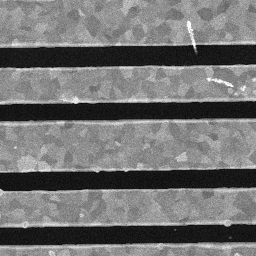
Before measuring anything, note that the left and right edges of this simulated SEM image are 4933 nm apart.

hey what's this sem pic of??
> lines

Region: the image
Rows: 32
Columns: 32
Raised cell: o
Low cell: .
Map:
oooooooooooooooooooooooooooooooo
oooooooooooooooooooooooooooooooo
oooooooooooooooooooooooooooooooo
oooooooooooooooooooooooooooooooo
oooooooooooooooooooooooooooooooo
oooooooooooooooooooooooooooooo..
................................
................................
oo..oooooooooooooooooooooooooooo
oooooooooooooooooooooooooooooooo
oooooooooooooooooooooooooooooooo
oooooooooooooooooooooooooooooooo
oooooooooooooooooooooooooooooooo
................................
................................
oooooooooooooooooooooooooooooooo
oooooooooooooooooooooooooooooooo
oooooooooooooooooooooooooooooooo
oooooooooooooooooooooooooooooooo
oooooooooooooooooooooooooooooooo
oooooooooooooooooooooooooooooooo
oooo............................
................................
................................
oooooooooooooooooooooooooooooooo
oooooooooooooooooooooooooooooooo
oooooooooooooooooooooooooooooooo
oooooooooooooooooooooooooooooooo
................................
................................
...................oo..oooo.oooo
oooooooooooooooooooooooooooooooo